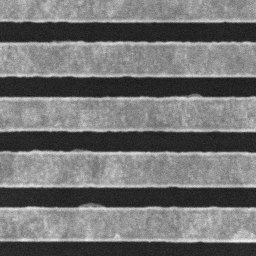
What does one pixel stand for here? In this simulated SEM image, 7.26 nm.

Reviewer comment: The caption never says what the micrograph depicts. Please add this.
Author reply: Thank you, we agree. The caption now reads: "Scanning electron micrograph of lines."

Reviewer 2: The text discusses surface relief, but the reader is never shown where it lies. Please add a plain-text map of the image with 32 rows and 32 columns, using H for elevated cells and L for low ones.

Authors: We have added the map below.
HHHHHHHHHHHHHHHHHHHHHHHHHHHHHHHH
HHHHHHHHHHHHHHHHHHHHHHHHHHHHHHHH
HHHHHHHHHHHHHHHHHHHHHHHHHHHHHHHH
LLLLLLLLLLLLLLLLLLLLLLLLLLLLLLLL
LLLLLLLLLLLLLLLLLLLLLLLLLLLLLLLL
HHHHHHHHHHHHHHHHHHHHHHHHHHHHHHHH
HHHHHHHHHHHHHHHHHHHHHHHHHHHHHHHH
HHHHHHHHHHHHHHHHHHHHHHHHHHHHHHHH
HHHHHHHHHHHHHHHHHHHHHHHHHHHHHHHH
HLLLLLLLLHHHHHHLLHLHHHHHHHHHHHHH
LLLLLLLLLLLLLLLLLLLLLLLLLLLLLLLL
LLLLLLLLLLLLLLLLLLLLLLLLLLLLLLLL
HHHHHHHHHHHHHHHHHHHHHHHHHHHHHHHH
HHHHHHHHHHHHHHHHHHHHHHHHHHHHHHHH
HHHHHHHHHHHHHHHHHHHHHHHHHHHHHHHH
HHHHHHHHHHHHHHHHHHHHHHHHHHHHHHHH
LLLLLLLLLLLLLLLLLLLLLLLLLLLLLLLL
LLLLLLLLLLLLLLLLLLLLLLLLLLLLLLLL
LLLLLLLLLLLLLLLLLLLLLLLLLLLLLLLL
HHHHHHHHHHHHHHHHHHHHHHHHHHHHHHHH
HHHHHHHHHHHHHHHHHHHHHHHHHHHHHHHH
HHHHHHHHHHHHHHHHHHHHHHHHHHHHHHHH
HHHHHHHHHHHHHHHHHHHHHHHHHHHHHHHH
LLLLLLLLLLLLLLLLLLLLLLLLLLLLLLLL
LLLLLLLLLLLLLLLLLLLLLLLLLLLLLLLL
LLLLLLLLLLLLLLLLLLLLLLLLLLLLLLLL
HHHHHHHHHHHHHHHHHHHHHHHHHHHHHHHH
HHHHHHHHHHHHHHHHHHHHHHHHHHHHHHHH
HHHHHHHHHHHHHHHHHHHHHHHHHHHHHHHH
HHHHHHHHHHHHHHHHHHHHHHHHHHHHHHHH
LLLLLLLLLLLLLLLLLLLLLLLLLLLLLLLL
LLLLLLLLLLLLLLLLLLLLLLLLLLLLLLLL